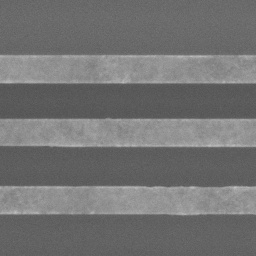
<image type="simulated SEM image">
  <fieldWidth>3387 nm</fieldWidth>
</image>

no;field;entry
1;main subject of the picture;lines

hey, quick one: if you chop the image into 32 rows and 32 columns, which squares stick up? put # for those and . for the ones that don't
................................
................................
................................
................................
................................
................................
................................
################################
################################
################################
................................
................................
................................
................................
................................
################################
################################
################################
................................
................................
................................
................................
................................
################################
################################
################################
################################
................................
................................
................................
................................
................................